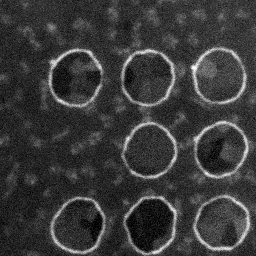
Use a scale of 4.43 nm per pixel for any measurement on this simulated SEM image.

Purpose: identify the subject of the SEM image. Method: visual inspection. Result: a regular array of raised bodies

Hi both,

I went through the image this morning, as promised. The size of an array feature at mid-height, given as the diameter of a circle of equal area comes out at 234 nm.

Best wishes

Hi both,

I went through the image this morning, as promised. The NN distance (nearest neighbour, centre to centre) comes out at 316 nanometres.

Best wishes